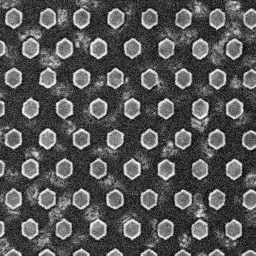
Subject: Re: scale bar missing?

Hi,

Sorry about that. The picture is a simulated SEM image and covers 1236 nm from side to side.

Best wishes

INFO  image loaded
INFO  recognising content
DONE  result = a regular array of raised bodies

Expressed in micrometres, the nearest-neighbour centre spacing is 0.164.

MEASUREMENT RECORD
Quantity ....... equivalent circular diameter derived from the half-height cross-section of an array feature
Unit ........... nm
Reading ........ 82